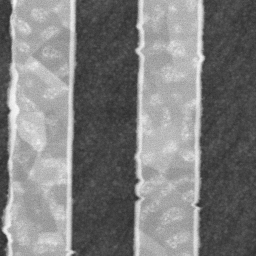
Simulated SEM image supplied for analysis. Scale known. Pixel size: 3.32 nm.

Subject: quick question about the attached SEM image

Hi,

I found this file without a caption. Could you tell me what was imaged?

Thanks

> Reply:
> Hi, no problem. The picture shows one or a few lines or trenches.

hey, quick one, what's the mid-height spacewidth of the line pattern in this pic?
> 229 nm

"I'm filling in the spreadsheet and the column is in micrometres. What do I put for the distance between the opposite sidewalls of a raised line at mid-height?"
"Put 0.193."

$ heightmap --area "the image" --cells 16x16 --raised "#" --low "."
.####....####...
.####....###....
.####....###....
.####....####...
.###.....###....
.###.....###....
.###.....###....
.###.....###....
.###.....###....
.###.....###....
.###.....###....
.###.....###....
.###.....###....
####.....###....
####.....###....
.###.....###....